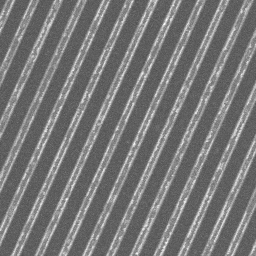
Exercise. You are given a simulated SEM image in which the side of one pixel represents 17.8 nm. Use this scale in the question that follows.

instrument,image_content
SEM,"parallel lines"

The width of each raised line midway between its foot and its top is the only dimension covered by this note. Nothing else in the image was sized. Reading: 122 nanometers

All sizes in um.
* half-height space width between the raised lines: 0.262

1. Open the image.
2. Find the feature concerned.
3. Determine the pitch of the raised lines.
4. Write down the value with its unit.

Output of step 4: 386 nm